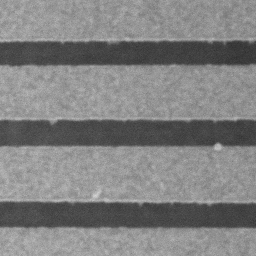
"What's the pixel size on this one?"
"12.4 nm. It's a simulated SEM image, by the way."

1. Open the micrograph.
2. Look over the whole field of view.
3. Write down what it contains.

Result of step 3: lines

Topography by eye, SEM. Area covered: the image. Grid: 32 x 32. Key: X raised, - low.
XXXXXXXXXXXXXXXXXXXXXXXXXXXXXXXX
XXXXXXXXXXXXXXXXXXXXXXXXXXXXXXXX
XXXXXXXXXXXXXXXXXXXXXXXXXXXXXXXX
XXXXXXXXXXXXXXXXXXXXXXXXXXXXXXXX
XXXXXXXXXXXXXXXXXXXXXXXXXXXXXXXX
--------------------------------
--------------------------------
--------------------------------
XXXXXXXXXXXXXXXXXXXXXXXXXXXXXXXX
XXXXXXXXXXXXXXXXXXXXXXXXXXXXXXXX
XXXXXXXXXXXXXXXXXXXXXXXXXXXXXXXX
XXXXXXXXXXXXXXXXXXXXXXXXXXXXXXXX
XXXXXXXXXXXXXXXXXXXXXXXXXXXXXXXX
XXXXXXXXXXXXXXXXXXXXXXXXXXXXXXXX
XXXXXXXXXXXXXXXXXXXXXXXXXXXXXXXX
--------------------------------
--------------------------------
--------------------------------
XXXXXXXXXXXXXXXXXXXXXXXXXXXXXXXX
XXXXXXXXXXXXXXXXXXXXXXXXXXXXXXXX
XXXXXXXXXXXXXXXXXXXXXXXXXXXXXXXX
XXXXXXXXXXXXXXXXXXXXXXXXXXXXXXXX
XXXXXXXXXXXXXXXXXXXXXXXXXXXXXXXX
XXXXXXXXXXXXXXXXXXXXXXXXXXXXXXXX
XXXXXXXXXXXXXXXXXXXXXXXXXXXXXXXX
--------------------------------
--------------------------------
--------------------------------
XXXXXX-XXXX-XX-X---XX----X------
XXXXXXXXXXXXXXXXXXXXXXXXXXXXXXXX
XXXXXXXXXXXXXXXXXXXXXXXXXXXXXXXX
XXXXXXXXXXXXXXXXXXXXXXXXXXXXXXXX